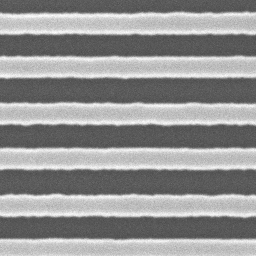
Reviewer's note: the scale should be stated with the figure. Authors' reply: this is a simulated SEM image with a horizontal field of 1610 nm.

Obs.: lines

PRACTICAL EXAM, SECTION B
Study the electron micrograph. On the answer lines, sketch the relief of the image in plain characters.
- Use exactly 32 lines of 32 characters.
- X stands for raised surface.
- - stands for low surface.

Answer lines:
--------------------------------
--------------------------------
XXXXXXXXXXXXXXXXXXXXXXXXXXXXXXXX
XXXXXXXXXXXXXXXXXXXXXXXXXXXXXXXX
--------------------------------
--------------------------------
--------------------------------
XXXXXXXXXXXXXXXXXXXXXXXXXXXXXXXX
XXXXXXXXXXXXXXXXXXXXXXXXXXXXXXXX
XXXXXXXXXXXXXXXXXXXXXXXXXXXXXXXX
--------------------------------
--------------------------------
--------------------------------
XXXXXXXXXXXXXXXXXXXXXXXXXXXXXXXX
XXXXXXXXXXXXXXXXXXXXXXXXXXXXXXXX
XXXX-XXXXXXXXXXXXXXXXXXXXXX-XXXX
--------------------------------
--------------------------------
--------------------------------
XXXXXXXXXXXXXXXXXXXXXXXXXXXXXXXX
XXXXXXXXXXXXXXXXXXXXXXXXXXXXXXXX
--------------------------------
--------------------------------
--------------------------------
-XXX--XX-X--X--XXXXXXX-XXX-XXX--
XXXXXXXXXXXXXXXXXXXXXXXXXXXXXXXX
XXXXXXXXXXXXXXXXXXXXXXXXXXXXXXXX
--------------------------------
--------------------------------
--------------------------------
XXXXXXXXXXXXXXXXXXXXXXXXXXXXXXXX
XXXXXXXXXXXXXXXXXXXXXXXXXXXXXXXX